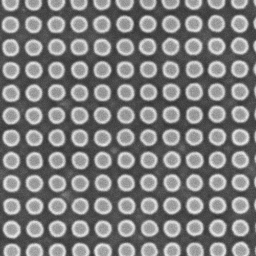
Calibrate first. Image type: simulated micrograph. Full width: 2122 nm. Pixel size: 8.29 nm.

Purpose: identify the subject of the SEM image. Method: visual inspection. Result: a regular array of raised bodies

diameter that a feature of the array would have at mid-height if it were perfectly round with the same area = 135 nanometers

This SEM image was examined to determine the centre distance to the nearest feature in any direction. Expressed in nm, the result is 186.